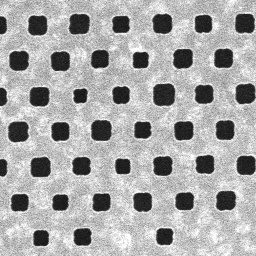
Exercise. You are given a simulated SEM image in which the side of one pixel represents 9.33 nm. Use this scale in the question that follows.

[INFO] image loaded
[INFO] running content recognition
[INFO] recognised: a regular array of holes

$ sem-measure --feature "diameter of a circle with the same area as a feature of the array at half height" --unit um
0.19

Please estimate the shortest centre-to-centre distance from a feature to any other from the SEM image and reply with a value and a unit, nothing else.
40.4 pixels